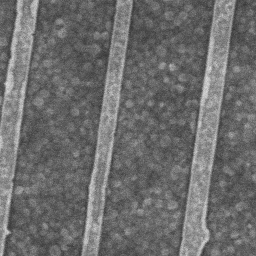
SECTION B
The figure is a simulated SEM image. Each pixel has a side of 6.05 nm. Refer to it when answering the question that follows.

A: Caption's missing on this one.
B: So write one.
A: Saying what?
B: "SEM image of one or a few lines or trenches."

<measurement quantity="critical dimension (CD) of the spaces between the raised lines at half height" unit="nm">482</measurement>